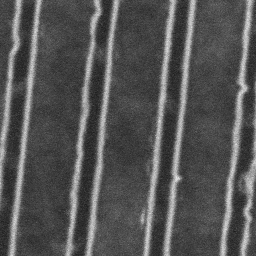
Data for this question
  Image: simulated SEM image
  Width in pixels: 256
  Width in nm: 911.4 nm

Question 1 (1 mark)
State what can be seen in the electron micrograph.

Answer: one or a few lines or trenches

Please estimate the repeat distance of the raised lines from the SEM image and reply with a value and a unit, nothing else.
0.273 um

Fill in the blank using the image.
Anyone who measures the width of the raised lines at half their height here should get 78.4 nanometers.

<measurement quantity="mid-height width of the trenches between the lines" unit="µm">0.197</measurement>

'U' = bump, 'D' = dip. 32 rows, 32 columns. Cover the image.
DDUUUDDDDDDDUUUDDDDDDUUUDDDDDDDU
DDUUUDDDDDDDUUDDDDDDDUUUDDDDDDDU
DDUUUDDDDDDDUUDDDDDDDUUUDDDDDDDU
DDUUUDDDDDDDUUDDDDDDDUUUDDDDDDDU
DDUUDDDDDDDDUUDDDDDDDUUUDDDDDDDU
DDUUDDDDDDDUUUDDDDDDDUUUDDDDDDDU
DDUUDDDDDDDUUUDDDDDDDUUUDDDDDDDU
DUUUDDDDDDDUUUDDDDDDDUUDDDDDDDUU
DUUUDDDDDDDUUUDDDDDDDUUDDDDDDDUU
DUUUDDDDDDDUUUDDDDDDUUUDDDDDDDUU
DUUUDDDDDDDUUDDDDDDDUUUDDDDDDDUU
DUUUDDDDDDDUUDDDDDDDUUUDDDDDDDUU
DUUUDDDDDDDUUDDDDDDDUUUDDDDDDDUU
DUUUDDDDDDDUUDDDDDDDUUUDDDDDDDUU
DUUDDDDDDDUUUDDDDDDDUUUDDDDDDDUU
DUUDDDDDDDUUUDDDDDDDUUUDDDDDDDUU
UUUDDDDDDDUUUDDDDDDDUUUDDDDDDUUU
UUUDDDDDDDUUUDDDDDDDUUDDDDDDDUUU
UUUDDDDDDDUUUDDDDDDDUUDDDDDDDUUU
UUUDDDDDDDUUUDDDDDDDUUDDDDDDDUUU
UUUDDDDDDDUUUDDDDDDUUUDDDDDDDUUU
UUUDDDDDDDUUDDDDDDDUUUDDDDDDDUUU
UUUDDDDDDUUUDDDDDDDUUUDDDDDDDUUD
UUDDDDDDDUUUDDDDDDDUUUDDDDDDDUUD
UUDDDDDDDUUUDDDDDDDUUUDDDDDDDUUD
UUDDDDDDDUUUDDDDDDDUUUDDDDDDDUUD
UUDDDDDDDUUUDDDDDDDUUDDDDDDDUUUD
UUDDDDDDDUUUDDDDDDDUUDDDDDDDUUUD
UUDDDDDDDUUDDDDDDDDUUDDDDDDDUUUD
UUDDDDDDDUUDDDDDDDUUUDDDDDDDUUUD
UUDDDDDDDUUDDDDDDDUUUDDDDDDDUUUD
UUDDDDDDUUUDDDDDDDUUUDDDDDDDUUDD